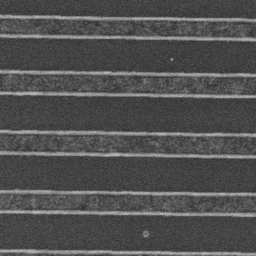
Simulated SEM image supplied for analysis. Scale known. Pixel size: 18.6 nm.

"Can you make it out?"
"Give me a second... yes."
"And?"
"lines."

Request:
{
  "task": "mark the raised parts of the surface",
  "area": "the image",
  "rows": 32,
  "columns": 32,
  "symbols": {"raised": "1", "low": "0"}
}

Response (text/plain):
00000000000000000000000000000000
00000000000000000000000000000000
11111111111111111111111111001000
11111111111111111111111111111111
00001111111111111111111111111111
00000000000000000000000000000000
00000000000000000000000000000000
00000000000000000000000000000000
00000000000000000000000000000000
11111111111111111111111111111111
11111111111111111111111111111111
11111111111111111111111111111111
00000000000000000000000000000000
00000000000000000000000000000000
00000000000000000000000000000000
00000000000000000000000000000000
00000000000000000000000000000000
11111111111111111111111111111111
11111111111111111111111111111111
00000000000000000000000000000001
00000000000000000000000000000000
00000000000000000000000000000000
00000000000000000000000000000000
00000000000000000000000000000000
11111111111111111111111111111111
11111111111111111111111111111111
00000000001111111111111111111111
00000000000000000000000000000000
00000000000000000000000000000000
00000000000000000000000000000000
00000000000000000000000000000000
11111110000000000000000000000000